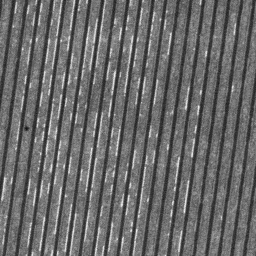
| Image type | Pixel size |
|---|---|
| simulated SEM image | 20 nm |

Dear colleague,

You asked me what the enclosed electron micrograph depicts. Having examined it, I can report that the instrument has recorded parallel lines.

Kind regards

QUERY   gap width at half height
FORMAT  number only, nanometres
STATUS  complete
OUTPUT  151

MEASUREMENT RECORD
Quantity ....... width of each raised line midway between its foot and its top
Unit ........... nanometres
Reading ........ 99